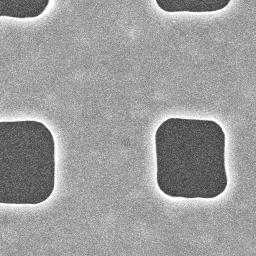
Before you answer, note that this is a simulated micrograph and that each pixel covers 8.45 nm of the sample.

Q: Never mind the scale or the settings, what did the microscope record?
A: holes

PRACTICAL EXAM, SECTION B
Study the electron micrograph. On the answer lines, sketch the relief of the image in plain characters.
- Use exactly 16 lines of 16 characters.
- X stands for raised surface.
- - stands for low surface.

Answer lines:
---XXXXXXX----XX
XXXXXXXXXXXXXXXX
XXXXXXXXXXXXXXXX
XXXXXXXXXXXXXXXX
XXXXXXXXXXXXXXXX
XXXXXXXXXXXXXXXX
XXXXXXXXXXXXXXXX
X-XXXXXXXX---XXX
---XXXXXXX----XX
---XXXXXXX----XX
---XXXXXXX----XX
---XXXXXXX----XX
---XXXXXXXXXXXXX
XXXXXXXXXXXXXXXX
XXXXXXXXXXXXXXXX
XXXXXXXXXXXXXXXX